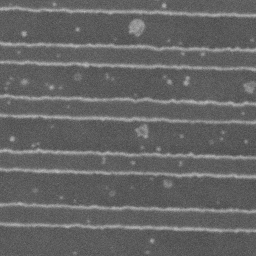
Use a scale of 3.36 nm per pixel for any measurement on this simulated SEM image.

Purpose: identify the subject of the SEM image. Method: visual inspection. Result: lines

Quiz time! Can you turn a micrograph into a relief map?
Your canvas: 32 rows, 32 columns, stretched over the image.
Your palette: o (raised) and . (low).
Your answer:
oooooooooooooooooooooooooooooooo
............oooooooooooooooooooo
................................
.................o..............
................................
ooo.oo..........................
oooooooooooooooooooooooooooooooo
oooooooooooooooooooooooooooooooo
......................oooooooooo
................................
................................
................................
ooooooooooooooooooo.............
oooooooooooooooooooooooooooooooo
oooooooooooooooooooooooooooooooo
................................
................................
................................
................................
ooooooooooooooooooooooooooo.....
oooooooooooooooooooooooooooooooo
....oooooooooooooooooooooooooooo
................................
................................
................................
.oo.............................
oooooooooooooooooooooooooooooooo
oooooooooooooooooooooooooooooooo
...................ooooooooooooo
................................
................................
................................